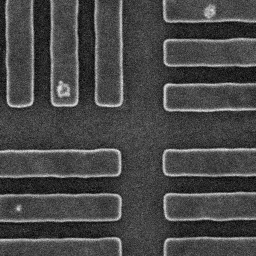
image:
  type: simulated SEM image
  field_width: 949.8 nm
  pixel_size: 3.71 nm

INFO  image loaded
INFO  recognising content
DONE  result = groups of lines, slits or small figures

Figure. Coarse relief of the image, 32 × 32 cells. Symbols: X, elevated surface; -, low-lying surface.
-XXX--XXXX--XXX-----XXXXXXXXXXXX
-XXX--XXXX--XXX------XXXXXXXXXXX
-XXX--XXXX--XXX------XXXXXXXXXXX
-XXX--XXXX--XXX-----------------
-XXX--XXXX--XXX-----------------
-XXX--XXXX--XXX------XXXXXXXXXXX
-XXX--XXXX--XXX------XXXXXXXXXXX
-XXX--XXXX--XXX------XXXXXXXXXXX
-XXX--XXXX--XXX-----------------
-XXX--XXXX--XXX-----------------
-XXX--XXXX--XXX------------XXX--
-XXX--XXXX--XXX------XXXXXXXXXXX
-XXX--XXXX--XXX------XXXXXXXXXXX
---------------------XXXXXXXXXXX
--------------------------------
--------------------------------
--------------------------------
--------------------------------
--------------------------------
XXXXXXXXXXXXXXX-----XXXXXXXXXXXX
XXXXXXXXXXXXXXX-----XXXXXXXXXXXX
XXXXXXXXXXXXXXX------XXXXXXXXXXX
--------------------------------
--------------------------------
XXXXXXXXXXXXXXX------XXXXXXXXXXX
XXXXXXXXXXXXXXX------XXXXXXXXXXX
XXXXXXXXXXXXXXX------XXXXXXXXXXX
XXXXXXXXXXXXXXX------XXXX-XXX---
--------------------------------
--------------------------------
XXXXXXXXXXXXXXX------XXXXXXXXXXX
XXXXXXXXXXXXXXX------XXXXXXXXXXX